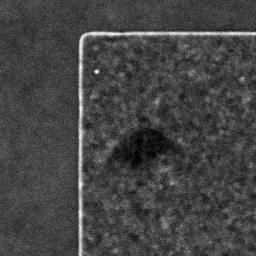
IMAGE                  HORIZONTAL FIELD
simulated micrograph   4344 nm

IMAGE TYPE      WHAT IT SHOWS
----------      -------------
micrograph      wiring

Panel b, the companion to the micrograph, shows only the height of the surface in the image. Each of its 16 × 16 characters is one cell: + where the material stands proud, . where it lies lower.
................
................
.....+++++++++++
.....+++++++++++
.....+++++++++++
.....+++++++++++
.....+++++++++++
.....+++++++++++
.....+++++++++++
.....+++++++++++
.....+++++++++++
.....+++++++++++
.....+++++++++++
.....+++++++++++
.....+++++++++++
.....+++++++++++